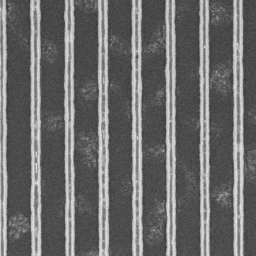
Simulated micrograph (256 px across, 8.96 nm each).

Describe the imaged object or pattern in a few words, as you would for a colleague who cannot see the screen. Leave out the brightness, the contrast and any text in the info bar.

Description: parallel lines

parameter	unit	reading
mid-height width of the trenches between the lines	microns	0.238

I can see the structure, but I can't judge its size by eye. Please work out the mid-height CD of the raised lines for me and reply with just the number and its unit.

7.12 px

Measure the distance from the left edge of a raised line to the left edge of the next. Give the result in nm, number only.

303